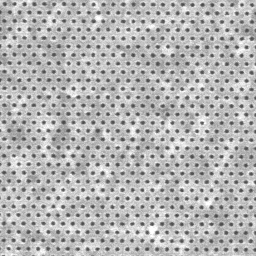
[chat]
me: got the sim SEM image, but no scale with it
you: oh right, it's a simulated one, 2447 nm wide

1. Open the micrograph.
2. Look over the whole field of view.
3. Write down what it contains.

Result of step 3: a regular array of holes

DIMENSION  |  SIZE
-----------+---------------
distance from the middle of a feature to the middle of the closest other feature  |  0.0906 microns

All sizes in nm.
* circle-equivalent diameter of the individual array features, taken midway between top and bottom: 45.8